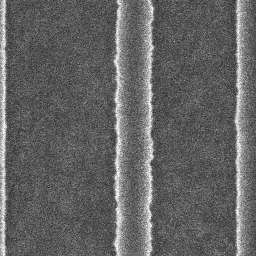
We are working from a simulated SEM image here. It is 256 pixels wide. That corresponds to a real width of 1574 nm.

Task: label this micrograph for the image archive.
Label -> one or a few lines or trenches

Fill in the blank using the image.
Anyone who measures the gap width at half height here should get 616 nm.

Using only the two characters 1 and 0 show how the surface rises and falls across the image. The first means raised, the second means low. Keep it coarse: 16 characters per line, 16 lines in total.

0000000110000001
0000000110000001
0000000110000001
0000000110000001
0000000110000001
0000000110000001
0000000110000001
0000000110000001
0000000110000001
0000000110000001
0000000110000001
0000000110000001
0000000110000001
0000000110000001
0000000110000001
0000000110000001